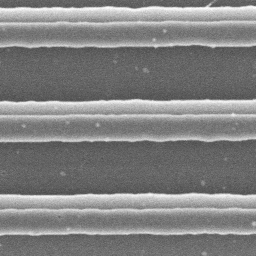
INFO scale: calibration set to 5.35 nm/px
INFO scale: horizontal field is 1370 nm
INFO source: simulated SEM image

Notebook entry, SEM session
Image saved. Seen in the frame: lines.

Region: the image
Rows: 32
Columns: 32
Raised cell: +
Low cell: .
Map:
................................
++++++++++++++++++++++++++++++++
++++++++++++++++++++++++++++++++
++++++++++++++++++++++++++++++++
++++++++++++++++++++++++++++++++
++++++++++++++++++++++++++++++++
................................
................................
................................
................................
................................
................................
................................
++++++++++++++++++++++++++++++++
++++++++++++++++++++++++++++++++
++++++++++++++++++++++++++++++++
++++++++++++++++++++++++++++++++
++++++++++++++++++++++...++.++..
................................
................................
................................
................................
................................
................................
++++++++++++++++++++++++++++++++
++++++++++++++++++++++++++++++++
++++++++++++++++++++++++++++++++
++++++++++++++++++++++++++++++++
++++++++++++++++++++++++++++++++
................................
................................
................................